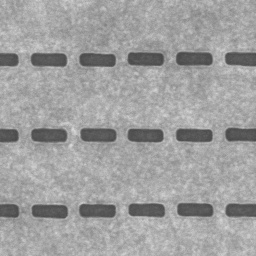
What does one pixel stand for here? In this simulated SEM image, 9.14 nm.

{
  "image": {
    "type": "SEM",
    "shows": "a regular array of holes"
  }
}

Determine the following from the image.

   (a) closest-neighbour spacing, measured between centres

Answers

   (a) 440 nanometers